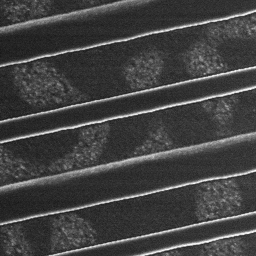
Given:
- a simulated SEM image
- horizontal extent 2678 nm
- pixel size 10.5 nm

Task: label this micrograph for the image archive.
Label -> lines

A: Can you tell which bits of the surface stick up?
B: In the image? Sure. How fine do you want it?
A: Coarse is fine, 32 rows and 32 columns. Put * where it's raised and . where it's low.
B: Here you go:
...............*****************
...........*********************
......**********************....
.*********************..........
******************..............
*************...................
*********.......................
****............................
...............................*
..........................******
......................**********
.................*************..
............*************.......
........*************...........
...*************................
***********.....................
*******.........................
**...........................***
........................********
...................*************
..............******************
..........*********************.
.....*********************......
**********************..........
*****************...............
*************...................
********........................
***........................*****
......................**********
..................***********...
.............***********........
........************............